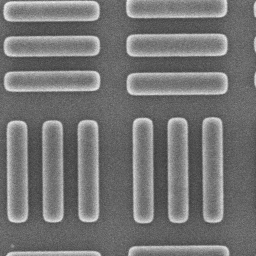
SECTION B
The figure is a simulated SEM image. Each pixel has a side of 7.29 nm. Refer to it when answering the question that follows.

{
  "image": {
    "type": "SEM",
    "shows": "groups of lines, slits or small figures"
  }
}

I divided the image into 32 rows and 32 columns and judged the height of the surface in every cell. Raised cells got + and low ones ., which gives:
.+++++++++++....++++++++++++....
.+++++++++++....++++++++++++....
.++++++++++.....................
................................
................++++++++++++....
.+++++++++++....++++++++++++....
.+++++++++++....++++++++++++....
................................
................................
.+++++++++++....++++++++++++....
.+++++++++++....++++++++++++....
................++++++++++++....
................................
................................
................................
.++...++..++.....++..++..+++....
.++..+++..++.....++..++..+++....
.++..+++..++.....++..++..+++....
.++..+++..++.....++..++..+++....
.++..+++..++.....++..++..+++....
.++..+++..++.....++..++..+++....
.++..+++..++.....++..++..+++....
.++..+++..++.....++..++..+++....
.++..+++..++.....++..++..+++....
.++..+++..++.....++..++..+++....
.++..+++..++.....++..++..+++....
.++...++..++.....++..++..+++....
.++...+...++.....++..++...+.....
................................
................................
................................
.....+++++++....++++++++++++....